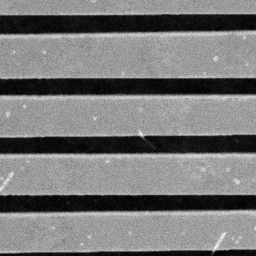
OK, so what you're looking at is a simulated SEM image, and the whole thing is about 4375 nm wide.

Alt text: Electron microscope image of lines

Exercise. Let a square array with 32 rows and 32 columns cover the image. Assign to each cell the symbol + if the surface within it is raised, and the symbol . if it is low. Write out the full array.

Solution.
++++++++++++++++++++++++++++++++
++++++++++++++++++++++++++++++++
................................
................................
++++++++++++++++++++++++++++++++
++++++++++++++++++++++++++++++++
++++++++++++++++++++++++++++++++
++++++++++++++++++++++++++++++++
++++++++++++++++++++++++++++++++
++++++++++++++++++++++++++++++++
................................
................................
++++++++++++++++++++++++++++++++
++++++++++++++++++++++++++++++++
++++++++++++++++++++++++++++++++
++++++++++++++++++++++++++++++++
++++++++++++++++++++++++++++++++
................................
................................
++++++++++++++++++++++++++++++++
++++++++++++++++++++++++++++++++
++++++++++++++++++++++++++++++++
++++++++++++++++++++++++++++++++
++++++++++++++++++++++++++++++++
................................
................................
...........+++++++++++++++++++++
++++++++++++++++++++++++++++++++
++++++++++++++++++++++++++++++++
++++++++++++++++++++++++++++++++
++++++++++++++++++++++++++++++++
++++............................